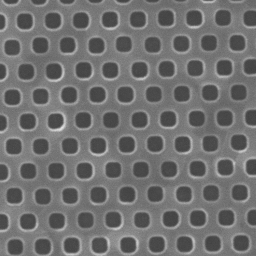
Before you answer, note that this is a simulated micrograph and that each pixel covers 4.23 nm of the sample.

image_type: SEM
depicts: a regular array of holes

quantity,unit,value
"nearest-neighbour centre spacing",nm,118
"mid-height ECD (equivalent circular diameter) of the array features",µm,0.0724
